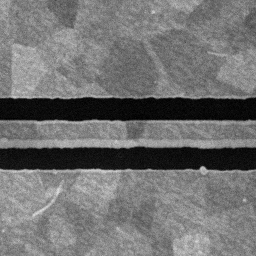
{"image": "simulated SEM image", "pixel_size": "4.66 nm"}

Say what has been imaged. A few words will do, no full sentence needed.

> lines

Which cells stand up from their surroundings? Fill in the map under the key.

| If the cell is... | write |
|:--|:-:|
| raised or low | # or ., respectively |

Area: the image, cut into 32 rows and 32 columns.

################################
################################
################################
################################
################################
################################
################################
################################
################################
################################
################################
################################
................................
................................
................................
################################
################################
################################
................................
................................
................................
################################
################################
################################
################################
################################
################################
################################
################################
################################
################################
################################